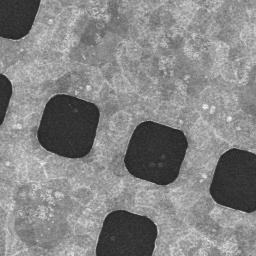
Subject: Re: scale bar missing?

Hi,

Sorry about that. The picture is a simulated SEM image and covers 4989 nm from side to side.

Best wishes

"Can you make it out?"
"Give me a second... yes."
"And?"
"holes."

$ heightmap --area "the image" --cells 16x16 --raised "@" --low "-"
--@@@@@@@@@@@@@@
--@@@@@@@@@@@@@@
@@@@@@@@@@@@@@@@
@@@@@@@@@@@@@@@@
@@@@@@@@@@@@@@@@
-@@@@@@@@@@@@@@@
-@@---@@@@@@@@@@
@@@---@@@@@@@@@@
@@----@@----@@@@
@@@---@@----@@--
@@@@@@@@---@@---
@@@@@@@@@@-@@---
@@@@@@@@@@@@@---
@@@@@@@--@@@@@@@
@@@@@@----@@@@@@
@@@@@@----@@@@@@